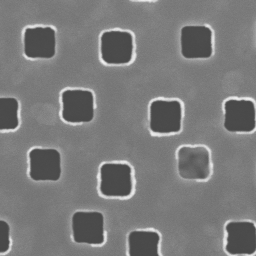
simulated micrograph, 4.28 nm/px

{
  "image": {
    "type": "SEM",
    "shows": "a regular array of holes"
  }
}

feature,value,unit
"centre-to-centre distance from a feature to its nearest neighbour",295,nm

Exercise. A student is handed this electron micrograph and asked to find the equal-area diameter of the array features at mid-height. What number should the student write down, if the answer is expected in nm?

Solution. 145